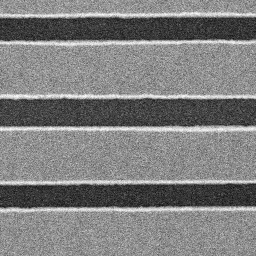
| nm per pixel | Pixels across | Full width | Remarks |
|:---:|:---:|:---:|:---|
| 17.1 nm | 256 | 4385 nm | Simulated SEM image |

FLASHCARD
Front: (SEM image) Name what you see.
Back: lines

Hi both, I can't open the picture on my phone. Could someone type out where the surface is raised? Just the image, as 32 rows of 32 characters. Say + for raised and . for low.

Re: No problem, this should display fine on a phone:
++++++++++++++++++++++++++++++++
++++++++++++++++++++++++++++++++
................................
................................
................................
++++++++++++++++++++++++++++++++
++++++++++++++++++++++++++++++++
++++++++++++++++++++++++++++++++
++++++++++++++++++++++++++++++++
++++++++++++++++++++++++++++++++
++++++++++++++++++++++++++++++++
++++++++++++++++++++++++++++++++
................................
................................
................................
................................
++++++++++++++++++++++++++++++++
++++++++++++++++++++++++++++++++
++++++++++++++++++++++++++++++++
++++++++++++++++++++++++++++++++
++++++++++++++++++++++++++++++++
++++++++++++++++++++++++++++++++
++++++++++++++++++++++++++++++++
................................
................................
................................
++++++++++++++++++++++++++++++++
++++++++++++++++++++++++++++++++
++++++++++++++++++++++++++++++++
++++++++++++++++++++++++++++++++
++++++++++++++++++++++++++++++++
++++++++++++++++++++++++++++++++